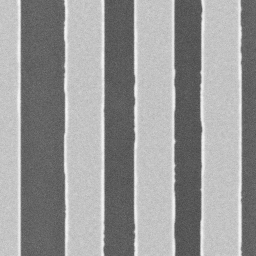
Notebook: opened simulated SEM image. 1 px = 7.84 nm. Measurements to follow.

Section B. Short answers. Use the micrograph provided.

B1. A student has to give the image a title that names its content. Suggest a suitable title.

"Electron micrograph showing lines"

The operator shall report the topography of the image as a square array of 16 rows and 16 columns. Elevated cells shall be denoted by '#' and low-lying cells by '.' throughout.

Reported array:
#...##..###..##.
#...##..###..##.
#...##..###..##.
#...##..###..##.
#...##..###..##.
#...##..###..##.
#...##..###..##.
#...##..###..##.
#...##..###..##.
#...##..###..##.
#...##..###..##.
#...##..###..##.
#...##..###..##.
#...##..###..##.
#...##..###..##.
#...##..###..##.